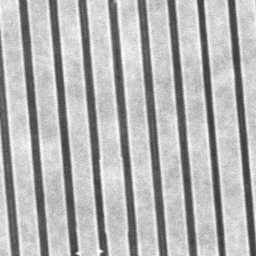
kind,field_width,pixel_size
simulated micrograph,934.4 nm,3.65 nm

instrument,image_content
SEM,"parallel lines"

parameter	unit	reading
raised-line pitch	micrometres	0.108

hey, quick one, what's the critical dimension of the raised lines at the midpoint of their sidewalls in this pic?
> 78.1 nm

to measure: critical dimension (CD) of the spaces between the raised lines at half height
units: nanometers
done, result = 30.4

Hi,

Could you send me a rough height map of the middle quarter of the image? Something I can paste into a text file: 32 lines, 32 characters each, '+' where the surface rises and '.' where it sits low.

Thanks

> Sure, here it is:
+++++..+++++...+++++..+++++..+++
+++++..+++++...+++++..+++++..+++
+++++..+++++...+++++..+++++..+++
+++++..+++++...+++++..+++++...++
+++++...+++++..+++++..++++++..++
+++++...+++++..+++++..++++++..++
+++++...+++++..+++++..++++++..++
+++++...+++++..+++++...+++++..++
+++++...+++++..+++++...+++++..++
+++++...+++++..+++++...+++++..++
.+++++..+++++...+++++..+++++..++
.+++++..+++++...+++++..+++++..++
.+++++..+++++...+++++..+++++...+
.+++++..+++++...+++++..+++++...+
.+++++..+++++...+++++..+++++...+
.+++++...++++...+++++..+++++...+
.+++++...+++++..+++++..+++++...+
.+++++...+++++..+++++..+++++...+
.+++++...+++++..+++++...+++++..+
.++++++..+++++..+++++...+++++..+
.++++++..+++++..+++++...+++++..+
..+++++..+++++...++++...+++++..+
..+++++..+++++...+++++..+++++..+
..+++++..+++++...+++++..+++++..+
..+++++..+++++...+++++..+++++..+
..+++++..++++++..+++++..+++++..+
..+++++..++++++..+++++..+++++..+
..+++++..++++++..+++++..++++++..
..+++++..++++++..+++++..++++++..
..+++++..++++++..+++++..++++++..
..+++++...+++++..+++++...+++++..
..+++++...+++++..+++++...+++++..